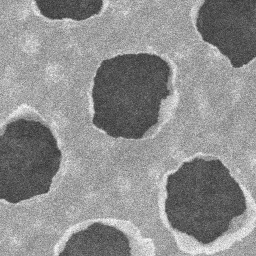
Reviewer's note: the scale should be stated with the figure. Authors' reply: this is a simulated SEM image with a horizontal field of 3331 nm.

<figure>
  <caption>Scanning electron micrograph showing holes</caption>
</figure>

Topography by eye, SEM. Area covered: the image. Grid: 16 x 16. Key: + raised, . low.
++....++++++....
++++++++++++....
+++++++++++++...
+++++++...++++..
++++++.....+++++
++++++.....+++++
++++++....++++++
+..+++....++++++
...++++..+++++++
....++++++++++++
....+++++++...++
...+++++++.....+
..++++++++.....+
++++++++++.....+
+++++...+++....+
++++.....+++++++